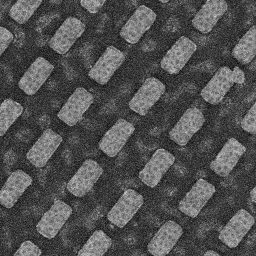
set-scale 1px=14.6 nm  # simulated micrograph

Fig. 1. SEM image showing a regular array of raised bodies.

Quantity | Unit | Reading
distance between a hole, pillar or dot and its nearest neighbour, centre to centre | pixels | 50.3